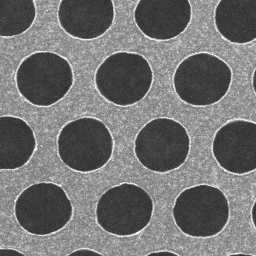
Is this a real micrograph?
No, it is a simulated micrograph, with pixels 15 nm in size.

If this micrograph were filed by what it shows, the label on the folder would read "a regular array of holes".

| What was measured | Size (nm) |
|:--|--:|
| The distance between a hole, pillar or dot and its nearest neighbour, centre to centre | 1150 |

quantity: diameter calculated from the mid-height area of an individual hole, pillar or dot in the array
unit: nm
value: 812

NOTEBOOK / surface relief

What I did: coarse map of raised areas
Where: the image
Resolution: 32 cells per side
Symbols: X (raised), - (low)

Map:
----XXXX------XXX-------XXX-----
----XXX-------XXX-------XXX-----
----XXX-------XXX-------XXX-----
----XXXX------XXX------XXXX-----
-XXXXXXXX---XXXXXX----XXXXXX----
XXXXXXXXXXXXXXXXXXXXXXXXXXXXXXXX
XXXXX-XXXXXXXXXXXXXXXXXXXXXXXXXX
XXX-----XXXXX-----XXXXX-----XXXX
XX-------XXX-------XXX-------XXX
XX-------XXX-------XXX-------XXX
XX-------XXX-------XXX-------XXX
XXX-----XXXXX-----XXXX------XXXX
XXXX---XXXXXXX---XXXXXX----XXXXX
XXXXXXXXXXXXXXXXXXXXXXXXXXXXXXXX
XXXXXXXXXXXXXXXXXXXXXXXXXXXXXXXX
---XXXXXX----XXXXX-----XXXXX----
----XXXX------XXX------XXXX-----
----XXX-------XXX-------XXX-----
----XXX-------XXX-------XXX-----
----XXX-------XXX------XXXX-----
---XXXXX-----XXXXX-----XXXX-----
XXXXXXXXXXXXXXXXXXXXXXXXXXXXX--X
XXXXXXXXXXXXXXXXXXXXXXXXXXXXXXXX
XXXX----XXXXXX----XXXXXX---XXXXX
XX------XXXXX------XXX------XXXX
XX-------XXX-------XXX------XXXX
XX-------XXX-------XXX-------XX-
XX-------XXX-------XXX------XXXX
XXX-----XXXXX-----XXXX------XXXX
XXXXXXXXXXXXXXXXXXXXXXXX--XXXXXX
XXXXXXXXXXXXXXXXXXXXXXXXXXXXXXXX
--XXXXXXX---XXXXXXXX-XXXXXXXXXXX